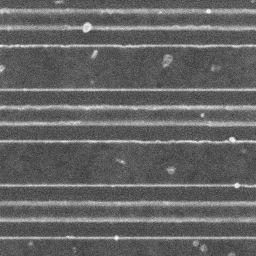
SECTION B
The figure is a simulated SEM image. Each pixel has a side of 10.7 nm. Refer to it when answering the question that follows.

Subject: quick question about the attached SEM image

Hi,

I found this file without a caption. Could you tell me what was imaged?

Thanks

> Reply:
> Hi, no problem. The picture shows lines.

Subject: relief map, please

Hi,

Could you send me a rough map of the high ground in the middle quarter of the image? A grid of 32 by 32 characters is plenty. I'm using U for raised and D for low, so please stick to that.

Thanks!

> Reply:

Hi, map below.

UUUUUUUUUUUUUUUUUUUUUUUUUUUUUUUU
UUUUUUUUUUUUUUUUUUUUUUUUUUUUUUUU
UUUUUUUUUUUUUUUUUUUUUUUUUUUUUUUU
UUUUUUUUUUUUUUUUUUUUUUUUUUUUUUUU
UUUUUUUUUUUUUUUUUUUUUUUUUUUUUUUU
UUUUUUUUUUUUUUUUUUUUUUUUUUUUUUUU
DDDDDDDDDDDDDDDDDDDDDDDDDDDDDDDD
DDDDDDDDDDDDDDDDDDDDDDDDDDDDDDDD
DDDDDDDDDDDDDDDDDDDDDDDDDDDDDDDD
DDDDDDDDDDDDDDDDDDDDDDDDDDDDDDDD
DDDDDDDDDDDDDDDDDDDDDDDDDDDDDDDD
UUUUUUUUUUUUUUUUUUUUUUUUUUUUUUUU
UUUUUUUUUUUUUUUUUUUUUUUUUUUUUUUU
UUUUUUUUUUUUUUUUUUUUUUUUUUUUUUUU
UUUUUUUUUUUUUUUUUUUUUUUUUUUUUUUU
DDDDDDDDDDDDDDDDDDDDDDDDDDDDDDDD
DDDDDDDDDDDDDDDDDDDDDDDDDDDDDDDD
DDDDDDDDDDDDDDDDDDDDDDDDDDDDDDDD
DDDDDDDDDDDDDDDDDDDDDDDDDDDDDDDD
UUUUUUUUUUUUUUUUUUUUDDUUDDUUUUUU
UUUUUUUUUUUUUUUUUUUUUUUUUUUUUUUU
UUUUUUUUUUUUUUUUUUUUUUUUUUUUUUUU
UUUUUUUUUUUUUUUUUUUUUUUUUUUUUUUU
UUUUUUUUUUUUUUUUUUUUUUUUUUUUUUUU
UUUUUUUUUUUUUUUUUUUUUUUUUUUUUUUU
UUUUUUUUUUUUUUUUUUUUUUUUUUUUUUUU
UUUUUUUUUUUUUUUUUUUUUUUUUUUUUUUU
UUUUUUUUUUUUUUUUUUUUUUUUUUUUUUUU
UUUUUUUUUUUUUUUUUUUUUUUUUUUUUUUU
UUUUUUUUUUUUUUUUUUUUUUUUUUUUUUUU
DDDDDDDDDDDDDDDDDDDDDDDDDDDDDDUD
DDDDDDDDDDDDDDDDDDDDDDDDDDDDDDDD